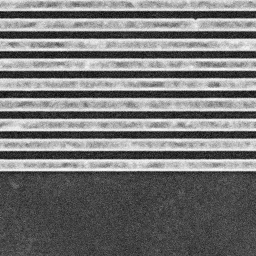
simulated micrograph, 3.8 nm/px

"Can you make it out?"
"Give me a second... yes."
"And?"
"parallel lines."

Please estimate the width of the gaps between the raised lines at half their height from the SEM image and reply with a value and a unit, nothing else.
7.87 pixels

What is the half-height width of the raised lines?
0.0451 µm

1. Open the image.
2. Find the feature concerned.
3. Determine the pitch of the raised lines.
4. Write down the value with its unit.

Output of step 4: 76.2 nm